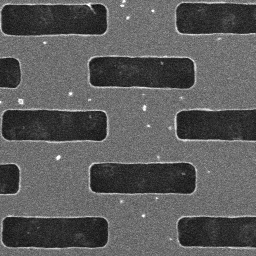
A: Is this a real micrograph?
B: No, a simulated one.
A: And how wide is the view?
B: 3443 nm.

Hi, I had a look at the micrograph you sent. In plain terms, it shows holes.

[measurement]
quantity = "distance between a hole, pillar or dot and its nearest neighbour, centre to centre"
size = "1390 nm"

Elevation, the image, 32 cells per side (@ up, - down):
@@@@@@@@@@@@-@@@@@@@@@@---------
-------------@@@@@@@@@----------
-------------@@@@@@@@@----------
-------------@@@@@@@@@----------
@@@@@@@@@@@@@@@@@@@@@@@@@@@@@@@@
@@@@@@@@@@@@@@@@@@@@@@@@@@@@@@@@
@@@@@@@@@@@@@@@@@@@@@@@@@@@@@@@@
--@@@@@@@@@-------------@@@@@@@@
---@@@@@@@@-------------@@@@@@@@
---@@@@@@@@-------------@@@@@@@@
--@@@@@@@@@-------------@@@@@@@@
@@@@@@@@@@@@@@@@@@@@@@@@@@@@@@@@
@@@@@@@@@@@@@@@@@@@@@@@@@@@@@@@@
@@@@@@@@@@@@@@@@@@@@@@@@@@@@@@@@
-------------@@@@@@@@@----------
-------------@@@@@@@@@----------
-------------@@@@@@@@@----------
@------------@@@@@@@@@@@--------
@@@@@@@@@@@@@@@@@@@@@@@@@@@@@@@@
@@@@@@@@@@@@@@@@@@@@@@@@@@@@@@@@
@-@@@@@@@@@@------------@@@@@@@@
--@@@@@@@@@-------------@@@@@@@@
--@@@@@@@@@--------------@@@@@@@
--@@@@@@@@@-------------@@@@@@@@
@@@@@@@@@@@@@@@@@@@@@@@@@@@@@@@@
@@@@@@@@@@@@@@@@@@@@@@@@@@@@@@@@
@@@@@@@@@@@@@@@@@@@@@@@@@@@@@@@@
-------------@@@@@@@@@----------
--------------@@@@@@@@----------
--------------@@@@@@@@----------
@------------@@@@@@@@@@---------
@@@@@@@@@@@@@@@@@@@@@@@@@@@@@@@@